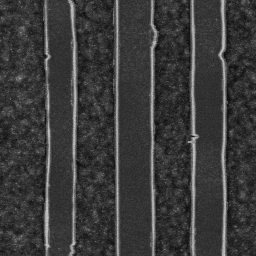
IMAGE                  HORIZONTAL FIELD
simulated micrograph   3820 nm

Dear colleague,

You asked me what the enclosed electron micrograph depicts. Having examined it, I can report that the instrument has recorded one or a few lines or trenches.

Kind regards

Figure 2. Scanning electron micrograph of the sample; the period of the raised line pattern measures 1100 nanometres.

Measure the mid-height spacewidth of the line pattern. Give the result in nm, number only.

627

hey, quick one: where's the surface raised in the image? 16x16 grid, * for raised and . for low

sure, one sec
...*...**...**..
...**..***..**..
...**..***..**..
...**..**...**..
...**..**...**..
...**..**...**..
...**..**...**..
...**..**...**..
...**..**...**..
...**..***..**..
...**..***..**..
...**..***..**..
...**..***..**..
...**..***..**..
...**..***..**..
...**..***..**..